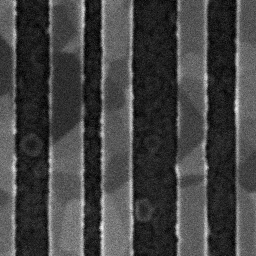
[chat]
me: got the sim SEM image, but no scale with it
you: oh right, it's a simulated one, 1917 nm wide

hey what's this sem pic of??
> one or a few lines or trenches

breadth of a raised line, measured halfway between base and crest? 30.4 px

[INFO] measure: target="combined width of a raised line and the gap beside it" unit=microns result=0.471